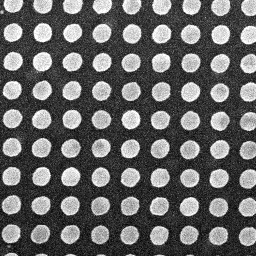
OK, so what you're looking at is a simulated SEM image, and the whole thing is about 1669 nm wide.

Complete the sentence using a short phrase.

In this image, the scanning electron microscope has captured a regular array of raised bodies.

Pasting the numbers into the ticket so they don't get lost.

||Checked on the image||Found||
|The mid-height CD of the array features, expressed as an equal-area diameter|119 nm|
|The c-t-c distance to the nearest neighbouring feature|28.6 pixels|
